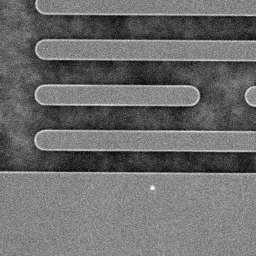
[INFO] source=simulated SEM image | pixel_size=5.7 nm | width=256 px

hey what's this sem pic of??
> groups of lines, slits or small figures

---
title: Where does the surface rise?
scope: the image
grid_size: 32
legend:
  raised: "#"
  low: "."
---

.....###########################
.....###########################
................................
................................
................................
.....###########################
.....###########################
...........................#####
................................
................................
................................
....#####################......#
.....####################......#
................................
................................
................................
.....#######################....
....############################
.....###########################
................................
................................
................................
################################
################################
################################
################################
################################
################################
################################
################################
################################
################################